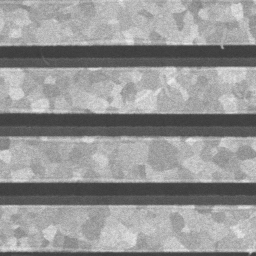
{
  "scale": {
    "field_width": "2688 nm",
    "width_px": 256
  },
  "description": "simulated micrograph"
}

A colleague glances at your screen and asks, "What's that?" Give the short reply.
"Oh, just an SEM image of lines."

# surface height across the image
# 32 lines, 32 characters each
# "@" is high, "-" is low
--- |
@@@@@@@@@@@@@@@@@@@@@@@@@@@@@@@@
@@@@@@@@@@@@@@@@@@@@@@@@@@@@@@@@
@@@@@@@@@@@@@@@@@@@@@@@@@@@@@@@@
@@@@@@@@@@@@@@@@@@@@@@@@@@@@@@@@
@@@@@@@@@@@@@@@@@@@@@@@@@@@@@@@@
@@@@@@@@@@@@@@@@@@@@@@@@@@@@@@@@
--------------------------------
--------------------------------
------@-----@@@@@@@@@@@@@@@@@@@@
@@@@@@@@@@@@@@@@@@@@@@@@@@@@@@@@
@@@@@@@@@@@@@@@@@@@@@@@@@@@@@@@@
@@@@@@@@@@@@@@@@@@@@@@@@@@@@@@@@
@@@@@@@@@@@@@@@@@@@@@@@@@@@@@@@@
@@@@@@@@@@@@@@@@@@@@@@@@@@@@@@@@
--------------------------------
--------------------------------
--------------------------------
@@@@@@@@@@@@@@@@@@@@@@@@@@@@@@@@
@@@@@@@@@@@@@@@@@@@@@@@@@@@@@@@@
@@@@@@@@@@@@@@@@@@@@@@@@@@@@@@@@
@@@@@@@@@@@@@@@@@@@@@@@@@@@@@@@@
@@@@@@@@@@@@@@@@@@@@@@@@@@@@@@@@
@@@@@@@@@@@@@@@@@@@@@@@@@@@@@@@@
--------------------------------
--------------------------------
--------------------------------
@@@@@@@@@@@@@@@@@@@@@@@@@@@@@@@@
@@@@@@@@@@@@@@@@@@@@@@@@@@@@@@@@
@@@@@@@@@@@@@@@@@@@@@@@@@@@@@@@@
@@@@@@@@@@@@@@@@@@@@@@@@@@@@@@@@
@@@@@@@@@@@@@@@@@@@@@@@@@@@@@@@@
-------------------------------@